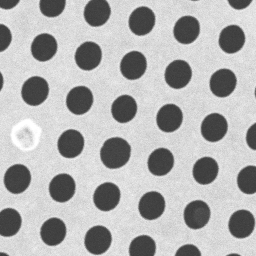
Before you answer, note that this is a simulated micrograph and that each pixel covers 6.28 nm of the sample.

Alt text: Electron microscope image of a regular array of holes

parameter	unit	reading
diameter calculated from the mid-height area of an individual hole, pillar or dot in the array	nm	180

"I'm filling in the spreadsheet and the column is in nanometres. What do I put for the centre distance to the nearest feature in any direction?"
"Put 280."